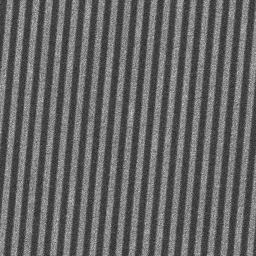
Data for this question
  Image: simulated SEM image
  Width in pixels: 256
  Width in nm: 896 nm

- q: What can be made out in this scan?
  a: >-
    parallel lines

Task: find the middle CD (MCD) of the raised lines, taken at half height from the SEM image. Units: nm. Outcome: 20.5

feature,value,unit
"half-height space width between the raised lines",23.9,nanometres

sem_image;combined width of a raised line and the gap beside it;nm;45.7